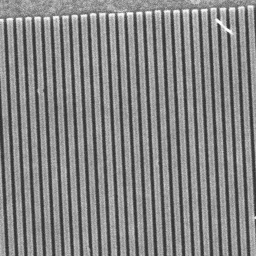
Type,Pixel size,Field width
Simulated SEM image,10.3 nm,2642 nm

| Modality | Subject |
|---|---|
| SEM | parallel lines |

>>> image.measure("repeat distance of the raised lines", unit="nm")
95.6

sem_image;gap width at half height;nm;37.4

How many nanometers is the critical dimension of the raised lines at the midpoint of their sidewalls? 55.4